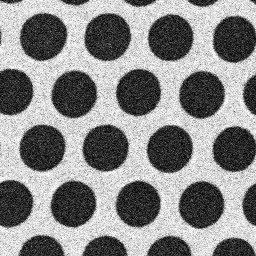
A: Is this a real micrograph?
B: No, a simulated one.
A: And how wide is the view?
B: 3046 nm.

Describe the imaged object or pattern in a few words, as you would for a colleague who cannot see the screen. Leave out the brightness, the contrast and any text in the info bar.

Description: a regular array of holes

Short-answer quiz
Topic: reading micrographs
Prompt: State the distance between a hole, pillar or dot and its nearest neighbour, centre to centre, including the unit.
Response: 0.751 um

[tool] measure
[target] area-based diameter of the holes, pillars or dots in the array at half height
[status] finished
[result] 556 nm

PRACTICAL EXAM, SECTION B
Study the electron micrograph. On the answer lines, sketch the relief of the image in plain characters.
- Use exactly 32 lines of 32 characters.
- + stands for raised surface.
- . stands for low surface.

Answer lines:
++++++++..++++++...+++++...+++++
++++++++++++++++++++++++++++++++
+++.....+++.....++++...+++++...+
+++.....+++.....+++.....+++.....
++......+++.....+++.....+++.....
+++.....+++.....+++.....+++.....
+++.....+++.....+++.....+++.....
+++++.+++++++.++++++..++++++...+
++++++++++++++++++++++++++++++++
...+++++...++++....+++++...+++++
....+++.....+++.....+++.....+++.
....+++.....++......++......++..
....+++.....+++.....++......++..
...++++.....+++....++++.....+++.
++++++++..+++++++.++++++..++++++
++++++++++++++++++++++++++++++++
+++.....+++....++++....+++++...+
+++.....++......+++.....+++.....
++......++......++......+++.....
+++.....++......++......+++.....
+++....++++....++++....++++....+
++++++++++++++++++++..++++++++++
++++++++++++++++++++++++++++++++
...++++....++++....++++....++++.
....+++.....+++.....+++.....+++.
....++......++......++......++..
....++......+++.....++......++..
...++++....++++....++++....++++.
++++++++++++++++++++++++..++++++
++++..+++++++.+++++++.++++++++++
+++....++++....++++....++++....+
++......++......++......+++.....